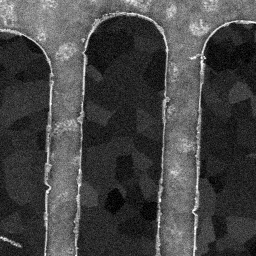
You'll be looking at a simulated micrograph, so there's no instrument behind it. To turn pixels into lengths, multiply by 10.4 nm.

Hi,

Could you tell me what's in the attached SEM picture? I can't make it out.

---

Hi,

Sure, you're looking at one or a few lines or trenches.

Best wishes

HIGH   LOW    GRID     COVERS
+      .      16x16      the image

................
......++++....++
++...+++++...+++
+++..+++++...+++
+++..+++++...+++
+++..+++++...+++
+++..+++++..++++
+++..+++++..++++
+++..+++++..++++
+++..+++++..++++
+++..+++++..++++
+++..+++++..++++
+++..+++++..++++
+++..+++++..++++
+++..+++++..++++
+++..+++++..++++